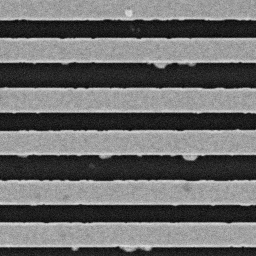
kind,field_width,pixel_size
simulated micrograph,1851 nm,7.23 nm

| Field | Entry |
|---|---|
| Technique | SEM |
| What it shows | lines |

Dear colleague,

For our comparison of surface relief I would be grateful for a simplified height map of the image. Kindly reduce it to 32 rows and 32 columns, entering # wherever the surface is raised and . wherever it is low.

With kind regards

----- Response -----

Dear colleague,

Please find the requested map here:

################################
################################
................................
................................
................................
################################
################################
################################
................................
................................
................................
################################
################################
################################
................................
................................
################################
################################
################################
................................
................................
................................
................................
################################
################################
################################
................................
................................
################################
################################
################################
................................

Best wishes